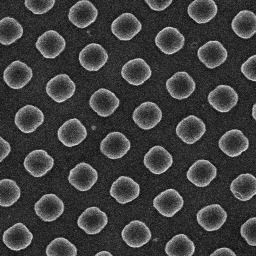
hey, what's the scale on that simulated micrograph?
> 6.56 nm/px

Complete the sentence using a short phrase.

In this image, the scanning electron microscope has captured a regular array of raised bodies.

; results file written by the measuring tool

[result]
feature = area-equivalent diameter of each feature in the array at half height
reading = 176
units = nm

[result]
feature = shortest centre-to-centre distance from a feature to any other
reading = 290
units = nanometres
